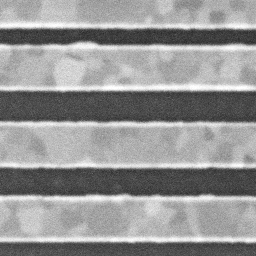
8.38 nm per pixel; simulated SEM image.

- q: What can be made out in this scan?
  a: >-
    lines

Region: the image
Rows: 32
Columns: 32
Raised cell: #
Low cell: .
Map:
################################
################################
################################
................................
................................
................................
################################
################################
################################
################################
################################
................................
................................
................................
................................
################################
################################
################################
################################
################################
################################
................................
................................
................................
................................
################################
################################
################################
################################
################################
................................
................................